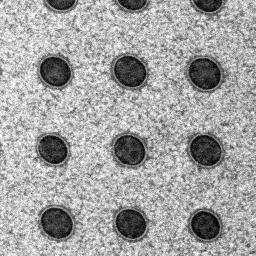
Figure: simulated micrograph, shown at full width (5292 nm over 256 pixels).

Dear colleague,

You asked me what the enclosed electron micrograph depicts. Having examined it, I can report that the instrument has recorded a regular array of holes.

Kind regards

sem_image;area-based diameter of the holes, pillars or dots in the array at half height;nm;655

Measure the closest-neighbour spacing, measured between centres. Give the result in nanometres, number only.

1540